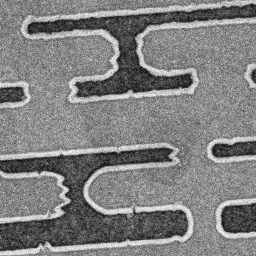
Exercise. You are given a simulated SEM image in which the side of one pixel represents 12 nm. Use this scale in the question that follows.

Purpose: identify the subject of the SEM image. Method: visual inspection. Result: one or a few lines or trenches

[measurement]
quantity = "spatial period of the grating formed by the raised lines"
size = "810 nanometers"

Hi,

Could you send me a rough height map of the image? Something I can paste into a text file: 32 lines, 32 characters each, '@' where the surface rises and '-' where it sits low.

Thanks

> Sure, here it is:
@@@@@@@@@@@@@@@@@@@@@@@@@@@@----
@@@@@@@@@@@@@@@-----------------
@@@@----------------------------
@@@-----------------@@@@@@@@@@@@
@@@@---@@@@@@-----@@@@@@@@@@@@@@
@@@@@@@@@@@@@@----@@@@@@@@@@@@@@
@@@@@@@@@@@@@@@--@@@@@@@@@@@@@@@
@@@@@@@@@@@@@@----@@@@@@@@@@@@@@
@@@@@@@@@@@@@@-----@@@@@@@@@@@@-
@@@@@@@@@@@@@-----------@@@@@@@-
@@-@@@@@@---------------@@@@@@@@
---@@@@@@-------------@@@@@@@@@@
---@@@@@@--@@@@@@@@@@@@@@@@@@@@@
@@@@@@@@@@@@@@@@@@@@@@@@@@@@@@@@
@@@@@@@@@@@@@@@@@@@@@@@@@@@@@@@@
@@@@@@@@@@@@@@@@@@@@@@@@@@@@@@@@
@@@@@@@@@@@@@@@@@@@@@@@@@@@@@@@@
@@@@@@@@@@@@@@@@@@@@@@@@@@@@@---
@@@@@@@@@@@@@@@-------@@@@------
@@--------------------@@@@------
---------------------@@@@@@@@@@@
------------@@@@@@@@@@@@@@@@@@@@
@@@@@@@----@@@@@@@@@@@@@@@@@@@@@
@@@@@@@@---@@@@@@@@@@@@@@@@@@@@@
@@@@@@@@---@@@@@@@@@@@@@@@@@@@@@
@@@@@@@@----@@@@@@@@@@@@@@@@----
@@@@@@@-----------------@@@-----
------------------------@@@-----
------------------------@@@-----
-----------------------@@@@@@@@@
---------------@@@@@@@@@@@@@@@@@
---@@@@@@@@@@@@@@@@@@@@@@@@@@@@@